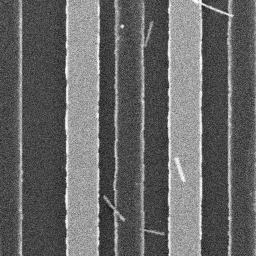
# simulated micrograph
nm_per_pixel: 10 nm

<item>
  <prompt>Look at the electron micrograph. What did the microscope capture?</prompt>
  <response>lines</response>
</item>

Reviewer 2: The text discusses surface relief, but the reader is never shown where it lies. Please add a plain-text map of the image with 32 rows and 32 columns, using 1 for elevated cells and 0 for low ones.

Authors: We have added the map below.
11000000111100011100011110000111
11000000111100011100011110000111
11100000111100011100011110000111
11100000111100011100011110000111
11100000111100011100011110000111
11100000111100011100011110000111
11100000111100011100011110000111
11100000111100011100011110000111
11100000111100011100011110000111
11100000111100111100011110000111
11100000111100111100011110000111
11000000111100111100011110000111
11100000111100011100011110000111
11000000111100011100011110000111
11000000111100111100011110000111
11000000111100111100011110000111
11000000111100111100011110000111
11000000111100111100011110000111
11100000111100111100011110000111
11100000111100111100011110000111
11100000111100111100011110000111
11100000111100111100011110000111
11000000111100111100011110000111
11000000111100111100011110000111
11000000111100111100011110000111
11000000111100111100011110000111
11100000111100111100011110000111
11100000111100111100011110000111
11100000111100111100011110000111
11100000111100111100011110000111
11100000111100111100011110000111
11100000111100111100011110000111